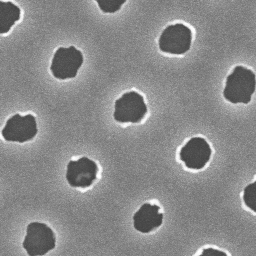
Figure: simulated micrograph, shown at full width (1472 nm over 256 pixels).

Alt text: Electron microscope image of holes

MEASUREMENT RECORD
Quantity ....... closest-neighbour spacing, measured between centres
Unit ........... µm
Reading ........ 0.45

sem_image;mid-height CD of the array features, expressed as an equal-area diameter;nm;184